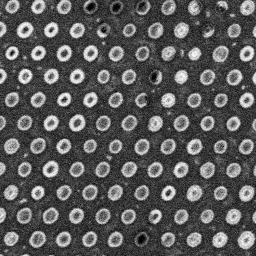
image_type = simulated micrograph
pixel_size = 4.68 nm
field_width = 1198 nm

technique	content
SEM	a regular array of raised bodies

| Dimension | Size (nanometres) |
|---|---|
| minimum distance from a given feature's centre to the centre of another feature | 122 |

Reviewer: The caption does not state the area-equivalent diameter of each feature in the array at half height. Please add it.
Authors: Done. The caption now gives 64 nm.